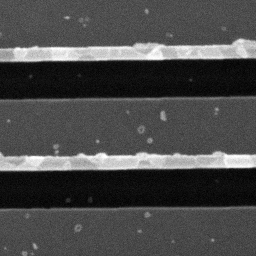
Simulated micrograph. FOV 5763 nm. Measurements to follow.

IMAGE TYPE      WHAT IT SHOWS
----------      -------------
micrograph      lines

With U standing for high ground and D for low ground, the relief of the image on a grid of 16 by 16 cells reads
UUUUUUUUUUUUUUUU
UUUUUUUUUUUUUUUU
UUUUUUUUUUUUUUUU
UUUUUUUUUUUUUUUU
DDDDDDDDDDDDDDDD
DDDDDDDDDDDDDDDD
UUUUUUUUUUUUUUUU
UUUUUUUUUUUUUUUU
UUUUUUUUUUUUUUUU
UUUUUUUUUUUUUUUU
UUUUUUUUUDDDDDDD
DDDDDDDDDDDDDDDD
DDDDDDDDDDDDDDDD
UUUUUUUUUUUUUUUU
UUUUUUUUUUUUUUUU
UUUUUUUUUUUUUUUU